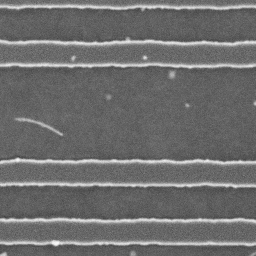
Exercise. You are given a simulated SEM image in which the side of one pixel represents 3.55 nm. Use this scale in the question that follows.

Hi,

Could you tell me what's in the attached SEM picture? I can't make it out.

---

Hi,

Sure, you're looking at lines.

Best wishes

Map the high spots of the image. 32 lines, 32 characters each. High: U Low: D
UUUUUUUUUUUUUUUUUUUUUUUUUUUUUUUU
DDDDDDDDDDDDDDDDDDDDDDDDDDDDDDDD
DDDDDDDDDDDDDDDDDDDDDDDDDDDDDDDD
DDDDDDDDDDDDDDDDDDDDDDDDDDDDDDDD
DDDDDDDDDDDDDDDDDDDDDDDDDDDDDDDD
UUUUUUUUUUUUUUUUUUUUUUUUUUUUUUUU
UUUUUUUUUUUUUUUUUUUUUUUUUUUUUUUU
UUUUUUUUUUUUUUUUUUUUUUUUUUUUUUUU
DDDDDDDDDDDDDDDDDDDDDDDDDDDDDDDD
DDDDDDDDDDDDDDDDDDDDDDDDDDDDDDDD
DDDDDDDDDDDDDDDDDDDDDDDDDDDDDDDD
DDDDDDDDDDDDDDDDDDDDDDDDDDDDDDDD
DDDDDDDDDDDDDDDDDDDDDDDDDDDDDDDD
DDDDDDDDDDDDDDDDDDDDDDDDDDDDDDDD
DDDDDDDDDDDDDDDDDDDDDDDDDDDDDDDD
DDDDDDDDDDDDDDDDDDDDDDDDDDDDDDDD
DDDDDDDDDDDDDDDDDDDDDDDDDDDDDDDD
DDDDDDDDDDDDDDDDDDDDDDDDDDDDDDDD
DDDDDDDDDDDDDDDDDDDDDDDDDDDDDDDD
DDDDDDDDDDDDDDDDDDDDDDDDDDDDDDDD
UUUUUUUUUUUUUUUUUUUUUUUUUUUUUUUU
UUUUUUUUUUUUUUUUUUUUUUUUUUUUUUUU
UUUUUUUUUUUUUUUUUUUUUUUUUUUUUUUU
DDDDDDDDDDDDDDDDDDDDDDDDDDDDDDDD
DDDDDDDDDDDDDDDDDDDDDDDDDDDDDDDD
DDDDDDDDDDDDDDDDDDDDDDDDDDDDDDDD
DDDDDDDDDDDDDDDDDDDDDDDDDDDDDDDD
UUUUUUUUUUUUUDDUUUUUUUUUUUUUUUUU
UUUUUUUUUUUUUUUUUUUUUUUUUUUUUUUU
UUUUUUUUUUUUUUUUUUUUUUUUUUUUUUUU
UUDDUUUUDUUUUUUUUUUUUUUUUUUUUUUU
DDDDDDDDDDDDDDDDDDDDDDDDDDDDDDDD